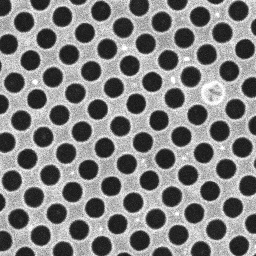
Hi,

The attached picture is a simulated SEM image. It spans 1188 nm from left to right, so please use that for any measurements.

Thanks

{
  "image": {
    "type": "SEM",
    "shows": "a regular array of holes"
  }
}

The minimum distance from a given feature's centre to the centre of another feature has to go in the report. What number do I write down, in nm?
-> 125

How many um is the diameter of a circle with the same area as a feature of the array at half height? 0.093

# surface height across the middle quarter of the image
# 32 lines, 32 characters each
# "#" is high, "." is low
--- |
#####....#####.....#####....####
####.....#####.....######.####..
####.....######...###...#####...
#####....###.#######....#####...
###########....####......#####..
#....#####.....#####....#######.
.....#####.....#####....##...###
.....#####....####.######.....##
#....###########....#####.....##
##..###...######....#####.....##
######.....#####....######...###
.#####.....#####....###########.
.#####.....######.####....#####.
.######...###..######.....#####.
.###.#######....#####.....######
###....####......#####....######
##.....#####.....######.###....#
##.....######...##...######.....
###...####.#######....#####.....
########....#####.....#####.....
..######.....####.....######..##
...#####.....#####...###..######
...#####....###########....#####
...######.####....#####.....####
..###...#####.....#####.....####
####....#####.....######...###..
####.....#####....###########...
####....#######.####...#####....
#####...##...######.....#####...
#########.....#####.....#####...
....#####.....#####.....########
.....#####....######..###....###